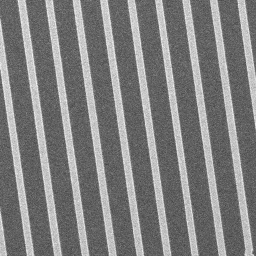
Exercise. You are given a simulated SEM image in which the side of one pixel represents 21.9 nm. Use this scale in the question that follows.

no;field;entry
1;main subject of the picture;parallel lines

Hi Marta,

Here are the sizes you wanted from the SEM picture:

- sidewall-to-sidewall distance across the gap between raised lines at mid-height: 452 nm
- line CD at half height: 146 nm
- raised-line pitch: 27.2 px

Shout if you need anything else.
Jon